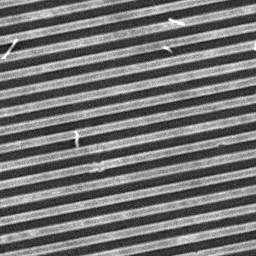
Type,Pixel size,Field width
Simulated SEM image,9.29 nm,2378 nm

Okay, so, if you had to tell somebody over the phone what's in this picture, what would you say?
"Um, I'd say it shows parallel lines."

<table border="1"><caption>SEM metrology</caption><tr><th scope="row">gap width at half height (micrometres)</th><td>0.098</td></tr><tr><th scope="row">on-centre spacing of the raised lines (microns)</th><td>0.165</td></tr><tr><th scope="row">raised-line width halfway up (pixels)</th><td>7.73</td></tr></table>